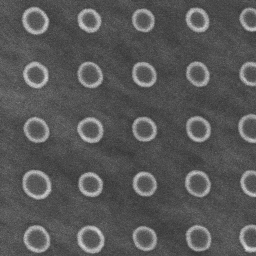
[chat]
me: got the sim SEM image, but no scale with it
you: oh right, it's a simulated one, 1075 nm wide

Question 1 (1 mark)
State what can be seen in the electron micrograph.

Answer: a regular array of raised bodies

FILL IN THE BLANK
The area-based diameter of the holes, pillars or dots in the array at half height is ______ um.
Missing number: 0.0979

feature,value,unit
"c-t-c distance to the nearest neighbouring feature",226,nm